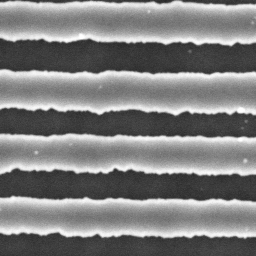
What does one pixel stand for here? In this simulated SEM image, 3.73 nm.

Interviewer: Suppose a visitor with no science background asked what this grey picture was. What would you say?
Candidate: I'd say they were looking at lines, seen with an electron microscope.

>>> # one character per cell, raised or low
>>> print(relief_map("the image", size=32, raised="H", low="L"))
HHHHHHHLHHHHHHHHHHHHLHHHHLLLLLLL
HHHHHHHHHHHHHHHHHHHHHHHHHHHHHHHH
HHHHHHHHHHHHHHHHHHHHHHHHHHHHHHHH
HHHHHHHHHHHHHHHHHHHHHHHHHHHHHHHH
HHHHHHHHHHHHHHHHHHHHHHHHHHHHHHHH
LLLLLLLLLLLLLLLLLLLLLLLLLLLLHLLL
LLLLLLLLLLLLLLLLLLLLLLLLLLLLLLLL
LLLLLLLLLLLLLLLLLLLLLLLLLLLLLLLL
LLLLLLLLLLLLLLLLLLLLLLLLLLLLLLLL
HHHHHHHHHHHHHHHHHHHHHHHHHHHHHHHH
HHHHHHHHHHHHHHHHHHHHHHHHHHHHHHHH
HHHHHHHHHHHHHHHHHHHHHHHHHHHHHHHH
HHHHHHHHHHHHHHHHHHHHHHHHHHHHHHHH
LLLHHHLHHHHHHHHHHHHHHHHHHHHHHHHH
LLLLLLLLLLLLLLLLLLLLLLLLLLLLLLLL
LLLLLLLLLLLLLLLLLLLLLLLLLLLLLLLL
LLLLLLLLLLLLLLLLLLLLLLLLLLLLLLLL
HHHHHHHHHHHHHHHHHHHHHHHHHHHHHHHH
HHHHHHHHHHHHHHHHHHHHHHHHHHHHHHHH
HHHHHHHHHHHHHHHHHHHHHHHHHHHHHHHH
HHHHHHHHHHHHHHHHHHHHHHHHHHHHHHHH
HLLLLLLLLHLHHHLLLLHHHHHHHHHHHHHH
LLLLLLLLLLLLLLLLLLLLLLLLLLLLLLLL
LLLLLLLLLLLLLLLLLLLLLLLLLLLLLLLL
LLLLLLLLLLLLLLLLLLLLLLLLLLLLLLLL
HHHHHHHHHHHHHHHHHHHHHHHHHHHHHHHH
HHHHHHHHHHHHHHHHHHHHHHHHHHHHHHHH
HHHHHHHHHHHHHHHHHHHHHHHHHHHHHHHH
HHHHHHHHHHHHHHHHHHHHHHHHHHHHHHHH
LLLLLLLLHLHLLHLLLHLLHHLHLLHHHHHH
LLLLLLLLLLLLLLLLLLLLLLLLLLLLLLLL
LLLLLLLLLLLLLLLLLLLLLLLLLLLLLLLL